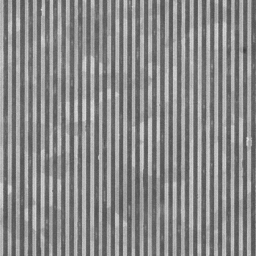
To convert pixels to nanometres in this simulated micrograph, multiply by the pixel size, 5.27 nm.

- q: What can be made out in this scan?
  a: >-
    parallel lines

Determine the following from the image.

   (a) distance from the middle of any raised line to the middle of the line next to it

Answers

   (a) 0.0435 µm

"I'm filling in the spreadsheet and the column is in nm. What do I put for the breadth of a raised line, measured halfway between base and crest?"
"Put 15.8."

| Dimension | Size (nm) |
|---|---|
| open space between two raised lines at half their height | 27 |